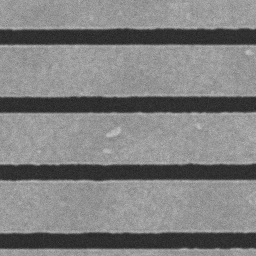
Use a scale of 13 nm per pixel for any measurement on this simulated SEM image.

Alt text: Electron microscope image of lines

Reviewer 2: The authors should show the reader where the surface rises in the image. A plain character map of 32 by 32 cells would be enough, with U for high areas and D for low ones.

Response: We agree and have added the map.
UUUUUUUUUUUUUUUUUUUUUUUUUUUUUUUU
UUUUUUUUUUUUUUUUUUUUUUUUUUUUUUUU
UUUUUUUUUUUUUUUUUUUUUUUUUUUUUUUU
UUUUUUUUUUUUUUDDUUUUDDDUUDUDUUDU
DDDDDDDDDDDDDDDDDDDDDDDDDDDDDDDD
DDDDDDDDDDDDDDDDDDDDDDDDDDDDDDDD
UUUUUUUUUUUUUUUUUUUUUUUUUUUUUUUU
UUUUUUUUUUUUUUUUUUUUUUUUUUUUUUUU
UUUUUUUUUUUUUUUUUUUUUUUUUUUUUUUU
UUUUUUUUUUUUUUUUUUUUUUUUUUUUUUUU
UUUUUUUUUUUUUUUUUUUUUUUUUUUUUUUU
UUUUUUUUUUUUUUUUUUUUUUUUUUUUUUUU
DDDDDDDDDDDDDDDDDDDDDDDDDDDDDDDD
DDDDDDDDDDDDDDDDDDDDDDDDDDDDDDDD
UUUUUUUUUUUUUUUUUUUUUUUUUUUUUUUU
UUUUUUUUUUUUUUUUUUUUUUUUUUUUUUUU
UUUUUUUUUUUUUUUUUUUUUUUUUUUUUUUU
UUUUUUUUUUUUUUUUUUUUUUUUUUUUUUUU
UUUUUUUUUUUUUUUUUUUUUUUUUUUUUUUU
UUUUUUUUUUUUUUUUUUUUUUUUUUUUUUUU
DUUDUDDUDDDDUUDDDDDDDDDDDDDDDDDD
DDDDDDDDDDDDDDDDDDDDDDDDDDDDDDDD
DDDDDDDDDDDDDDDDDDDDDDDDDDDDDDDD
UUUUUUUUUUUUUUUUUUUUUUUUUUUUUUUU
UUUUUUUUUUUUUUUUUUUUUUUUUUUUUUUU
UUUUUUUUUUUUUUUUUUUUUUUUUUUUUUUU
UUUUUUUUUUUUUUUUUUUUUUUUUUUUUUUU
UUUUUUUUUUUUUUUUUUUUUUUUUUUUUUUU
UUUUUUUUUUUUUUUUUUUUUUUUUUUUUUUU
DDDDDDDDDDDDDDDDDDDDDDDDDDDDDDDD
DDDDDDDDDDDDDDDDDDDDDDDDDDDDDDDD
UUUUUUUUUUUUUUUUUUUUUUUUUUUUUUUU